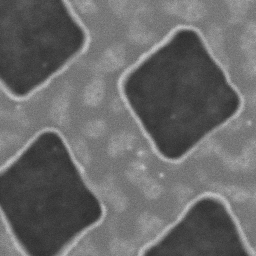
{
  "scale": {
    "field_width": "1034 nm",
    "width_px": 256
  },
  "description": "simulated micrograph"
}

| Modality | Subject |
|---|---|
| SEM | holes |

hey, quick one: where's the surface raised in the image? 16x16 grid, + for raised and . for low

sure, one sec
....++++++++++++
.....+++++++++++
.....++++++..+++
.....++++....+++
....++++......++
..++++++.......+
++++++++.......+
+++++++++.....++
++..+++++....+++
+...++++++..++++
.....+++++++++++
.....+++++++++++
......+++++++.++
......+++++...++
+....+++++.....+
+...+++++......+